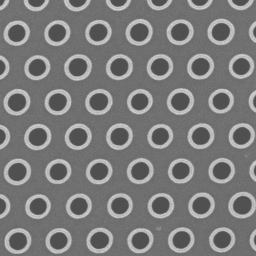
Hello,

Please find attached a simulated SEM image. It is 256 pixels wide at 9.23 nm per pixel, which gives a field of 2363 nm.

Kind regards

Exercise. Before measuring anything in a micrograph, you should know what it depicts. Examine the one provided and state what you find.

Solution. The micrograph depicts a regular array of ring-shaped raised bodies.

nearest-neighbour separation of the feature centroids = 370 nm